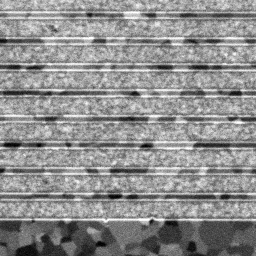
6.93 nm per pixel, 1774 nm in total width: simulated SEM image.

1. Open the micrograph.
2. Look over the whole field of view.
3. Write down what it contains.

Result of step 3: parallel lines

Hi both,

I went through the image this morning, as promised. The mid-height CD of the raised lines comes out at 46.7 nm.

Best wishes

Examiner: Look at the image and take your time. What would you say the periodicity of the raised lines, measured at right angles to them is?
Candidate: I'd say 26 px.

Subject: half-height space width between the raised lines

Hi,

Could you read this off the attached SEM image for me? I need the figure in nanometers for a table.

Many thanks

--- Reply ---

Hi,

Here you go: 133